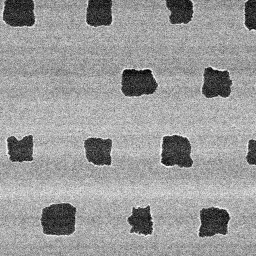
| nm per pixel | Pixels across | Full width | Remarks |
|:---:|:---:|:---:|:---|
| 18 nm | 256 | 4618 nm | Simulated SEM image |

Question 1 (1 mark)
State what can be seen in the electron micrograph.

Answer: a regular array of holes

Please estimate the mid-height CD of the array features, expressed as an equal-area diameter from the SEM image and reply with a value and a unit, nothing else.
572 nanometers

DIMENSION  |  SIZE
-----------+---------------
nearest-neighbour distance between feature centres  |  1410 nm